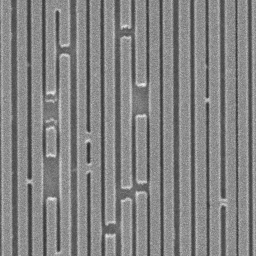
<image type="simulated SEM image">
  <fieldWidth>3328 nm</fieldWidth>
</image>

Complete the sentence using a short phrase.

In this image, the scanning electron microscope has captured parallel lines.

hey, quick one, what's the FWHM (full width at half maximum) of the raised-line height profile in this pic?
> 135 nanometres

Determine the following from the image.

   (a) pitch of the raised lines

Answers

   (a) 192 nm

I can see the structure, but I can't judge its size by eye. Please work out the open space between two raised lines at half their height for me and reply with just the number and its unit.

61.7 nm